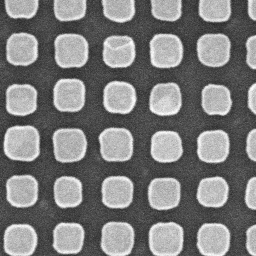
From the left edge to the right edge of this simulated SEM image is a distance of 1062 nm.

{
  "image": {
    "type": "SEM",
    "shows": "a regular array of raised bodies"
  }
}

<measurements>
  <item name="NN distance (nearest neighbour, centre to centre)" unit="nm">191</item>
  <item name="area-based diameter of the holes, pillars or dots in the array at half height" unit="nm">135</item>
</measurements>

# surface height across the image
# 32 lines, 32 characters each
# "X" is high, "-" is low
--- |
-XXXX--XXXX--XXXX--XXXX--XXXX--X
-XXX---XXXX--XXXX--XXXX--XXXX--X
--------X-----XX-----X----XX----
--------------------------------
--XX----XX----------XX---XXX----
-XXXX--XXXX--------XXXX--XXXX--X
-XXXX--XXXX--XXXX--XXXX--XXXX--X
-XXX---XXXX--XXXX--XXXX--XXX---X
--------------------------------
--------------------------------
-------XXX----XX----XX----------
-XXXX--XXXX--XXXX--XXXX--XXXX--X
-XXXX--XXX---XXXX--XXXX--XXXX--X
-XXX---XXX---XXX---XXX---XXXX--X
--------------------------------
--------------------------------
-XXXX--XXX---XXX----XX----XX---X
-XXXX--XXXX-XXXXX--XXXX--XXX---X
-XXXX--XXXX--XXXX--XXXX--XXX---X
-XXXX--XXX---XXX---XXX---XXX---X
--------------------------------
--------------------------------
-XXX---XXX---XXX---XXX---XXX---X
-XXXX--XXX---XXXX--XXX---XXX---X
-XXXX--XXX---XXX---XXX---XXX---X
--XX---XXX---XXX---XXX---XXX---X
--------------------------------
--------------------------------
-XXX---XXX---XXX---XXXX--XXX---X
-XXX---XXX---XXXX--XXXX--XXXX--X
-XXX---XXX---XXXX--XXXX--XXX---X
-XXX---XXX---XXX---XXX---XXX---X